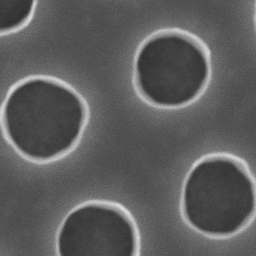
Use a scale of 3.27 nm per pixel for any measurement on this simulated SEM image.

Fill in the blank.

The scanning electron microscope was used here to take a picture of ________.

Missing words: holes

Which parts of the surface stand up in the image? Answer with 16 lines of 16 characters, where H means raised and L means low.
LLHHHHHHHHHHHHHH
LHHHHHHHHHHHHHHH
HHHHHHHHHLLLHHHH
HHHHHHHHHLLLLHHH
HHHHHHHHHLLLLHHH
HLLLHHHHHLLLLHHH
LLLLLHHHHHLHHHHH
LLLLLHHHHHHHHHHH
HLLLLHHHHHHHHHHH
HLLLHHHHHHHHHHHH
HHHHHHHHHHHHLLLH
HHHHHHHHHHHHLLLL
HHHHHHHHHHHHLLLL
HHHHLLLLHHHHLLLL
HHHHLLLLHHHHHLLH
HHHHLLLLHHHHHHHH